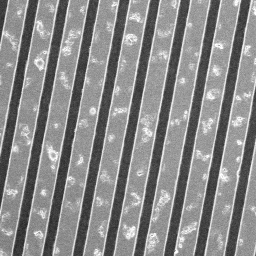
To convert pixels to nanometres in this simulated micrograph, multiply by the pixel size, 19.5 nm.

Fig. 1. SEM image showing parallel lines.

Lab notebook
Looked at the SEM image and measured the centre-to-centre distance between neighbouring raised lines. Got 29.9 px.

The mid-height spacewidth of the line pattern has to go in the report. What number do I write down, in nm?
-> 187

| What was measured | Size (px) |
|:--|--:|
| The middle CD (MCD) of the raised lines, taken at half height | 20.2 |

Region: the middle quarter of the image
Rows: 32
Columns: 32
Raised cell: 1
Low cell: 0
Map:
11100011111001111100011111000111
11100011111001111100011111001111
11100111111001111100011111001111
11100111110001111100111110001111
11000111110001111100111110001111
11000111110001111100111110001111
11000111110011111000111110001111
11000111110011111000111110011111
11001111100011111000111110011111
10001111100011111001111100011111
10001111100011111001111100011111
10001111100111110001111100011111
10001111000111110001111100111110
10011111000111110001111100111110
10011111000111110011111000111110
10011111000111110011111000111110
00011111000111110011111000111110
00011111001111100011111001111110
00011111001111100011111001111100
00111110001111100011111001111100
00111110001111100111110001111100
00111110001111100111110001111100
00111110011111000111110001111000
00111110011111000111110011111000
01111100011111000111110011111000
01111100011111001111100011111000
01111100011111001111100011111001
01111100011111001111100011111001
01111100111110001111100111110001
01111000111110001111100111110001
11111000111110001111000111110001
11111000111110011111000111110001